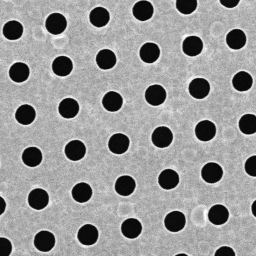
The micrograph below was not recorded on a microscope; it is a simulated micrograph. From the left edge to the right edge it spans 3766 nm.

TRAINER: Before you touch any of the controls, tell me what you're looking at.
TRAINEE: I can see a regular array of holes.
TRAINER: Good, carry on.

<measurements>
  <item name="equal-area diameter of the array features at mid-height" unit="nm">310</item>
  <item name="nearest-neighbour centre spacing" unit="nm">626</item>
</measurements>